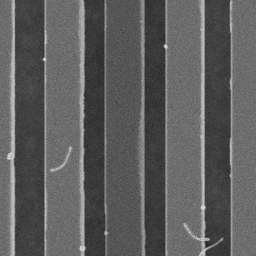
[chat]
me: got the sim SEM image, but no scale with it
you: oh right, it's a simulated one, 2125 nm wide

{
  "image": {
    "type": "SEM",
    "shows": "lines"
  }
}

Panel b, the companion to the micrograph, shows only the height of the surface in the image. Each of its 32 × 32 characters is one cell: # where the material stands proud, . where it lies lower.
##....####...#####...####....###
##....####...#####...####....###
##....####...#####...####....###
##....####...#####...####....###
##....####...#####...####....###
##....####...#####...####....###
##....####...#####...####....###
##....####...#####...####....###
##....####...#####...####....###
##....####...#####...####....###
##....####...#####...####....###
##....####...#####...####....###
##....####...#####...####....###
##....####...#####...####....###
##....####...#####...####....###
##....####...#####...####....###
##....####...#####...####....###
##....####...#####...####....###
##....####...#####...####....###
##....####...#####...####....###
##....####...#####...####....###
##....####...#####...####....###
##....####...#####...####....###
##....####...#####...####....###
##....####...#####...####....###
##....####...#####...#####...###
##....####...#####...#####...###
##....####...#####...####....###
##....####...#####...####....###
##....####...#####...#####...###
##....#####..#####...#####...###
##....#####..#####...#####...###